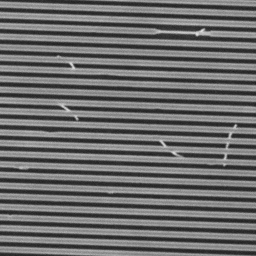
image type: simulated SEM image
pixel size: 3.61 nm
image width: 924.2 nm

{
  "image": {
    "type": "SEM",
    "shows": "parallel lines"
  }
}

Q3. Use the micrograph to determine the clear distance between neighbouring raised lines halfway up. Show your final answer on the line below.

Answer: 21.2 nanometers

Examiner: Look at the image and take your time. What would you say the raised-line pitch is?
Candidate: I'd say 38.4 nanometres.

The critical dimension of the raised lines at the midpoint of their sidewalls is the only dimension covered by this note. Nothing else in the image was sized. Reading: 5.12 pixels